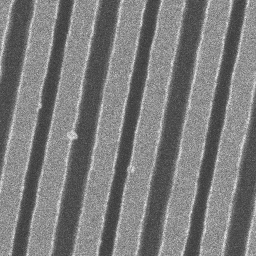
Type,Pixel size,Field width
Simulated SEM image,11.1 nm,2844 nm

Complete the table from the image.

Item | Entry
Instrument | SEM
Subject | parallel lines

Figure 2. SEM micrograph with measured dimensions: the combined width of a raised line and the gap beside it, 468 nanometers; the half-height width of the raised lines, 290 nm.